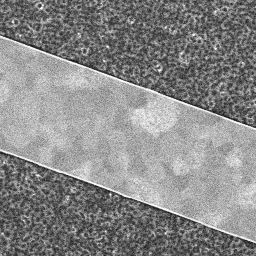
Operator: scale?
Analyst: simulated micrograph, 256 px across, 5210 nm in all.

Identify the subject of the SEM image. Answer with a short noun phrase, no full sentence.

one or a few lines or trenches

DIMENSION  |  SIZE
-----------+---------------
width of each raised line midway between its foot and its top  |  2180 nm